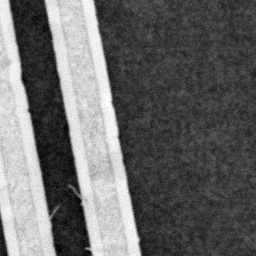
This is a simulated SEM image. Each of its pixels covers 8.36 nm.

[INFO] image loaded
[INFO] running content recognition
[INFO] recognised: one or a few lines or trenches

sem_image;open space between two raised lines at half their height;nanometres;380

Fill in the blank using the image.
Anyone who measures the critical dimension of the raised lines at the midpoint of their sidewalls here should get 321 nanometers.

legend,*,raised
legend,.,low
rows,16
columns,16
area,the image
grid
...***..........
*..***..........
*...**..........
*...**..........
*...**..........
*...***.........
*...***.........
**...**.........
**...**.........
**...**.........
**...**.........
**...***........
***..***........
***...**........
.**...**........
.**...**........